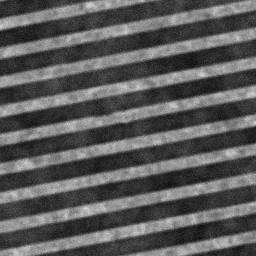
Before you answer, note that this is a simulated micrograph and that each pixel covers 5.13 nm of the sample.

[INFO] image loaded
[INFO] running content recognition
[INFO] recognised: parallel lines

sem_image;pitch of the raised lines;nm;146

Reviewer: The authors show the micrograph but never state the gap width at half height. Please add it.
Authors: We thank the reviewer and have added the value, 93.8 nanometers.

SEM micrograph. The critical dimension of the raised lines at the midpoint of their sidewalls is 51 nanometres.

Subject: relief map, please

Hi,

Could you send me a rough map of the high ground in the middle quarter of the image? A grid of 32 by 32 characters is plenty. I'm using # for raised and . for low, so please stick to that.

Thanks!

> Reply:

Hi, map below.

############....................
#######.........................
#.........................######
.....................###########
................#############...
...........############.........
.....#############..............
#############...................
########........................
##.........................#####
......................##########
.................#############..
............############........
.......############.............
.#############..................
#########.......................
###.........................####
.......................#########
..................##############
.............#############......
........#############...........
..##############................
###########.....................
######........................##
.........................#######
....................############
...............############.....
..........############..........
....#############...............
############....................
#######........................#
#.........................######